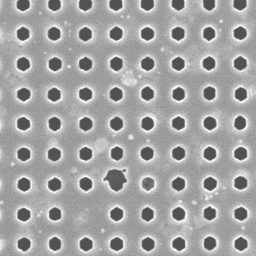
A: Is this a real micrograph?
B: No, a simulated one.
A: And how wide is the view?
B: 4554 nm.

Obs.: a regular array of holes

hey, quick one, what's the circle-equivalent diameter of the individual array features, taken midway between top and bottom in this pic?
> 245 nm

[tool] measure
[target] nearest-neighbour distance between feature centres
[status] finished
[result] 532 nm